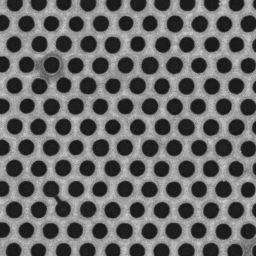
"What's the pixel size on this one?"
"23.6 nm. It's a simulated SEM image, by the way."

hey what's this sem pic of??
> a regular array of holes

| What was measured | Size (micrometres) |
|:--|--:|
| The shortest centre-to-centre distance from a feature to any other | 0.56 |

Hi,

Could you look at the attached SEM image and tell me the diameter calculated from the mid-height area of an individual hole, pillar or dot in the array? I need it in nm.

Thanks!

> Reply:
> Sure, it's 388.